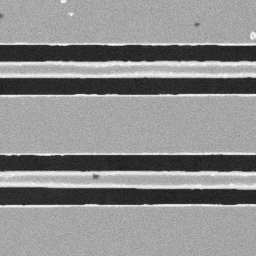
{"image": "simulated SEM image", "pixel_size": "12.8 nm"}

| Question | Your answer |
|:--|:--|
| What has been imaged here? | lines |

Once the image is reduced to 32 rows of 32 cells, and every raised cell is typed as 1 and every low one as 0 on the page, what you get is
11111111111111111111111111111111
11111111111111111111111111111111
11111111111111111111111111111111
11111111111111111111111111111111
11111111111111111111111111111111
11111111111111111111111111111111
00000000000000000000000000000000
00000000000000000000000000000000
11111111111111111111111111111111
11111111111111111111111111111111
00000000000000000000000000000000
00000000000000000000000000000000
11111111111111111111111111111111
11111111111111111111111111111111
11111111111111111111111111111111
11111111111111111111111111111111
11111111111111111111111111111111
11111111111111111111111111111111
11111111111111111111111111111111
00000000000000000000000000000000
00000000000000000000000000000000
00000110000001111100000000000000
11111111111111111111111111111111
00000000000000000111111111111111
00000000000000000000000000000000
00000000000000000000000000000000
11111111111111111111111111111111
11111111111111111111111111111111
11111111111111111111111111111111
11111111111111111111111111111111
11111111111111111111111111111111
11111111111111111111111111111111